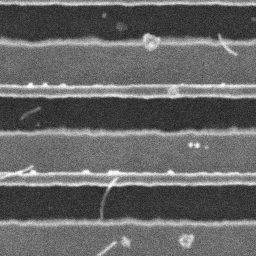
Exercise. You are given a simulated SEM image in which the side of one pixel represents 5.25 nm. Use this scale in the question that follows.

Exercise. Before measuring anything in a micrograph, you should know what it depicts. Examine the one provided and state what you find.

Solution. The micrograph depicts lines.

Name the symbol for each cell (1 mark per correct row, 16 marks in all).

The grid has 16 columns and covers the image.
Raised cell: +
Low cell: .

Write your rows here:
................
................
.........+......
++++++++++++++++
++++++++++++++++
++++++++++++++++
................
................
++++++++++++++++
++++++++++++++++
++++++++++++++++
++++++++++++++++
................
................
++++++++++++++++
++++++++++++++++